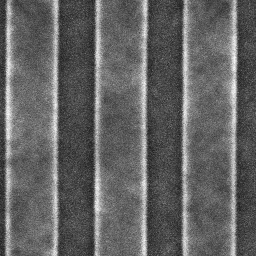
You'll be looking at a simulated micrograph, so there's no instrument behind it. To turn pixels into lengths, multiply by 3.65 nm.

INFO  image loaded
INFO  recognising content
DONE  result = one or a few lines or trenches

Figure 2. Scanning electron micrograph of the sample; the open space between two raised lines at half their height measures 39.3 pixels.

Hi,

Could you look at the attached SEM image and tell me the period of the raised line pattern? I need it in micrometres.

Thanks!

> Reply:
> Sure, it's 0.324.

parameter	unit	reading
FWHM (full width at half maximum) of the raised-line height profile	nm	182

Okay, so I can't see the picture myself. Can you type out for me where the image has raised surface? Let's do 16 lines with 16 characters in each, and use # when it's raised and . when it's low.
.###..###...###.
.###..###...###.
.###..###...###.
.###..###...###.
.###..###...###.
###...###...###.
###...###...###.
###...###...###.
###...###...###.
###...###...###.
###...###...###.
####..###...###.
####..###..####.
####..###..####.
####..###...###.
####..###...###.